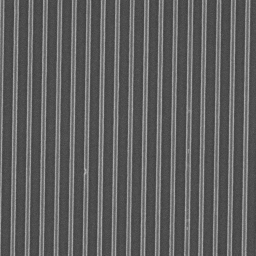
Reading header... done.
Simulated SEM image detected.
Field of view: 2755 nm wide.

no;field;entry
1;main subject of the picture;parallel lines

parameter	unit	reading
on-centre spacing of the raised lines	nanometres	156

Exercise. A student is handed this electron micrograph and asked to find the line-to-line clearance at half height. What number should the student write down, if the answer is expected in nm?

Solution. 117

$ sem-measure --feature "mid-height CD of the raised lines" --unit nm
36.3